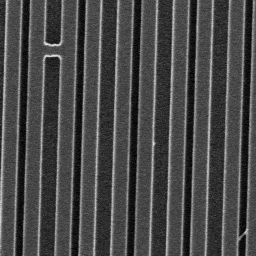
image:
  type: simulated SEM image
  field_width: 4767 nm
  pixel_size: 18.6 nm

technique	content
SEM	parallel lines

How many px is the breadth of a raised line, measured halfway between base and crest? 15.5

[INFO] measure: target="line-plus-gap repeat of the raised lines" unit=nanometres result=521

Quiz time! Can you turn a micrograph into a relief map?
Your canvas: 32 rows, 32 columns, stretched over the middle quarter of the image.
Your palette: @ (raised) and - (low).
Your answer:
@@@--@@@@----@@@@--@@@@----@@@@-
@@@--@@@@----@@@@--@@@@----@@@@-
@@@--@@@@----@@@@--@@@@----@@@@-
@@@--@@@@----@@@@--@@@@----@@@@-
@@@--@@@@----@@@@--@@@@----@@@@-
@@@--@@@@----@@@@--@@@@----@@@@-
@@@--@@@@----@@@@--@@@@----@@@@-
@@@--@@@@----@@@@--@@@@----@@@@-
@@@--@@@@----@@@---@@@@----@@@@-
@@@--@@@@----@@@---@@@@----@@@--
@@@--@@@@----@@@---@@@@----@@@--
@@@--@@@-----@@@---@@@@----@@@--
@@@--@@@-----@@@---@@@-----@@@--
@@@--@@@-----@@@---@@@-----@@@--
@@@--@@@-----@@@---@@@----@@@@--
@@---@@@-----@@@---@@@----@@@@--
@@---@@@-----@@@---@@@----@@@@--
@@---@@@-----@@@--@@@@----@@@@--
@@---@@@-----@@@--@@@@----@@@@--
@@---@@@-----@@@--@@@@----@@@@--
@@---@@@-----@@@--@@@@----@@@@--
@@---@@@----@@@@--@@@@----@@@@--
@@---@@@----@@@@--@@@@----@@@@--
@@---@@@----@@@@--@@@@----@@@@--
@@--@@@@----@@@@--@@@@----@@@@--
@@--@@@@----@@@@--@@@@----@@@@--
@@--@@@@----@@@@--@@@@----@@@@--
@@--@@@@----@@@@--@@@@----@@@@--
@@--@@@@----@@@@--@@@@----@@@@--
@@--@@@@----@@@@--@@@@----@@@@--
@@--@@@@----@@@@--@@@@----@@@@--
@@--@@@@----@@@@--@@@@----@@@@--